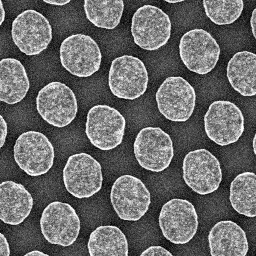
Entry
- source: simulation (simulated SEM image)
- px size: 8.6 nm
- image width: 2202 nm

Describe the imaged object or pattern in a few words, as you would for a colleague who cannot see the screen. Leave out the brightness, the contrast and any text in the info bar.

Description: a regular array of raised bodies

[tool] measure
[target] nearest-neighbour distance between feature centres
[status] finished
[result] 457 nm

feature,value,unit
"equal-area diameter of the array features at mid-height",354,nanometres